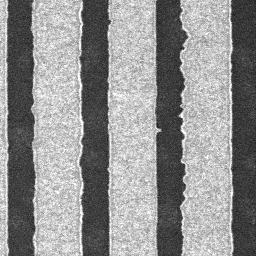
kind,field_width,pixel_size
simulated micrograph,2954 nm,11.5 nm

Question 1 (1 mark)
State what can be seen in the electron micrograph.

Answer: one or a few lines or trenches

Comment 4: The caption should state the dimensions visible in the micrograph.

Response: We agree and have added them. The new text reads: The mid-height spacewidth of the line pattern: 329 nm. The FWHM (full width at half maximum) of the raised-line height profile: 534 nm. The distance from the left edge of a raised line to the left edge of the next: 863 nm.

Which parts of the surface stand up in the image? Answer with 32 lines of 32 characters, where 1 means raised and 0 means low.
10001111110000111110000111111000
10001111110000111110000111111000
10001111110000111110000111111000
10001111110000111110000111111000
10001111110000111110000011111000
10001111110000111110000111111000
10001111110000111110000111111000
10001111110000111110000111111000
10001111110000111110000111111000
10001111110000111110000111111000
10001111110000111110000111111000
10001111110000111110000111111000
10001111110000111110000111111000
10001111110000111110000111111000
10001111110000111110000111111000
10001111110000111110000111111000
10001111110000111111000111111000
10001111110000111110000111111000
10001111110000111110000111111000
10001111110000111110000111111000
10001111110000111110000111111000
10001111110000111110000111111000
10000111110000111110000111111000
10000111110000111110000111111000
10001111110000111110000111111000
10001111110000111110000111111000
10001111110000111111000111111000
10001111110000111111000111111000
10001111110000111110000111111000
10001111110000111110000111111000
10001111110000111110000111111000
10001111110000111111000111111000